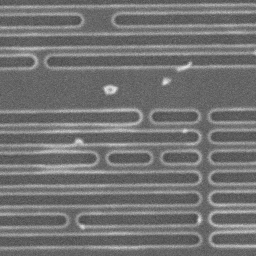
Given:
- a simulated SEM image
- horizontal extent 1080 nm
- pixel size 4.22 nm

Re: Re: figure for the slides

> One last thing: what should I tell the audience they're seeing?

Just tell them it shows groups of lines, slits or small figures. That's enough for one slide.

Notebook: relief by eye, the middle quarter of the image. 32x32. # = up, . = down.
...............................#
################################
################################
################################
################################
################################
################################
################################
################################
################################
################################
################################
...................###..........
...................###..........
...................####.........
################################
################################
................................
................................
...#............................
################################
################################
........###..........####.......
........###...........###.......
........###..........####.......
..##############################
################################
................................
................................
................................
################################
################################